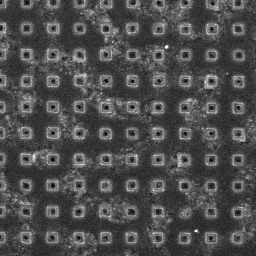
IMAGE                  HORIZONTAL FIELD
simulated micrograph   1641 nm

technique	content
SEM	holes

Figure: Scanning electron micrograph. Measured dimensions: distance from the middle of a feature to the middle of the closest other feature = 107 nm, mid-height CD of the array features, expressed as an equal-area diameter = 24.5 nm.